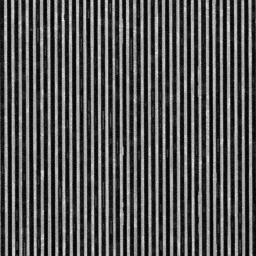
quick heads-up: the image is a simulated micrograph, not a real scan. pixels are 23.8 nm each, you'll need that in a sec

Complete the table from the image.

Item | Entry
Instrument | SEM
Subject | parallel lines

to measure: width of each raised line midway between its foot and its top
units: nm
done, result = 65.6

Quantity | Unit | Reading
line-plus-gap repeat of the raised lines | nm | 171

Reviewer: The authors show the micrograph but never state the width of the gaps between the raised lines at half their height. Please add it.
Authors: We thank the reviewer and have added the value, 113 nm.